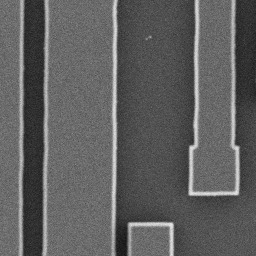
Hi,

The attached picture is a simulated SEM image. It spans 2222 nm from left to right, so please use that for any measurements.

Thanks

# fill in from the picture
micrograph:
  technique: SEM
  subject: groups of lines, slits or small figures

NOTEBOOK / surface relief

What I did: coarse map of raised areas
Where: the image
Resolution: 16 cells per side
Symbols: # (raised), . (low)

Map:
#..####.....###.
#..####.....###.
#..####.....###.
#..####.....###.
#..####.....###.
#..####.....###.
#..####.....###.
#..####.....###.
#..####.....###.
#..####.....###.
#..####.....###.
#..####.....###.
#..####.........
#..####.........
#..####.###.....
#..####.###.....